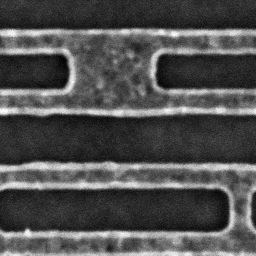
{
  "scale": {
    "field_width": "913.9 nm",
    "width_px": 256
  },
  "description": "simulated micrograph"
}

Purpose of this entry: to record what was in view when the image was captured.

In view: one or a few lines or trenches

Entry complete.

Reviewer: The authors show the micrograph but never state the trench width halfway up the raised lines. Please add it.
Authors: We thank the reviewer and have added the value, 169 nm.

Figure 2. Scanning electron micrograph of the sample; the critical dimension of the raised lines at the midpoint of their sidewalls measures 75 nm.